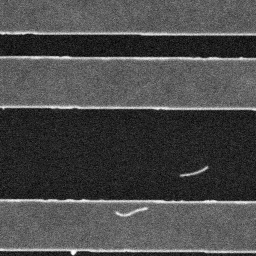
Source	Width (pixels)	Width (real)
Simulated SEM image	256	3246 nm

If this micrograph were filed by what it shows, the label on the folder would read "lines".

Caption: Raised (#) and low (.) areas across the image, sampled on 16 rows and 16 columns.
################
################
................
................
################
################
################
................
................
................
................
................
................
################
################
################